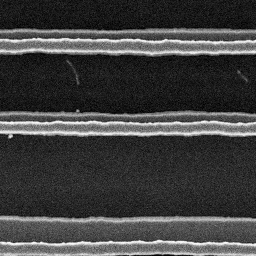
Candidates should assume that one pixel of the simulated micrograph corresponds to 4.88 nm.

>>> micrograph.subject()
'lines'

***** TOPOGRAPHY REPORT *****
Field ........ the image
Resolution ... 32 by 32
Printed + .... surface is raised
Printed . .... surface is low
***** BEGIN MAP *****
................................
................................
................................
................................
++++++++++++++++++++++++++++++++
++++++++++++++++++++++++++++++++
+++.....++++++++++++++++++++++++
................................
................................
................................
................................
................................
................................
................................
++++++++++++++++++++++++++++++++
++++++++++++++++++++++++++++++++
++++++++++++++++++++++++++++++++
................................
................................
................................
................................
................................
................................
................................
................................
................................
................................
+++++++++.++++.+++++++++++++++++
++++++++++++++++++++++++++++++++
++++++++++++++++++++++++++++++++
++++++++++++++++++++++++++++++++
++++++++++++++++++++++++++++++++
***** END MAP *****